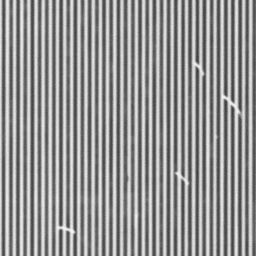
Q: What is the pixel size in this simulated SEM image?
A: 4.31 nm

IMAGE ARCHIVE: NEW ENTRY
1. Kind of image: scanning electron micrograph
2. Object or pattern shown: parallel lines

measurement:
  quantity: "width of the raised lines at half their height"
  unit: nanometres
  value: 14.6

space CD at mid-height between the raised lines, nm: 18.3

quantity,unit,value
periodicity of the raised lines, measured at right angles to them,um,0.0309